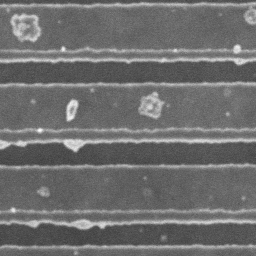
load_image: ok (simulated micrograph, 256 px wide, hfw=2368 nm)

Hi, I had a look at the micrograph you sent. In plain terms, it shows lines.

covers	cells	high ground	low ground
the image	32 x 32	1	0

00000000000000100111110011111111
11111111111111111111111111111111
11111111111111111111111111111111
11111111111111111111111111111111
11111111111111111111111111111111
11111111111111111111111111111111
11111111111111111111111111111111
11100010100110111111110010100110
00000000000000000000000000000000
00000000000000000000000000000000
00000000000010000011100001011111
11111111111111111111111111111111
11111111111111111111111111111111
11111111111111111111111111111111
11111111111111111111111111111111
11111111111111111111111111111111
11111111111111111111111111111111
11111111111111111111110111111111
00000000010000000000000000000000
00000000000000000000000000000000
00000000000000000000000000000000
11111111111111111111111111111111
11111111111111111111111111111111
11111111111111111111111111111111
11111111111111111111111111111111
11111111111111111111111111111111
11111111111111111111111111111111
11111111111111111111111111111111
00000000001000000000000000000000
00000000000000000000000000000000
00000000000000000000000000000000
11111111111111111111111111111111